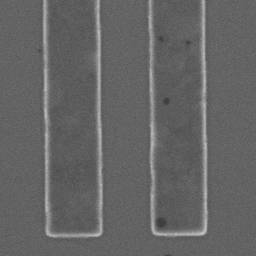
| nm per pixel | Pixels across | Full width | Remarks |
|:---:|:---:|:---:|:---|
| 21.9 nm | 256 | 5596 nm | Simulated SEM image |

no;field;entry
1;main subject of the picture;wiring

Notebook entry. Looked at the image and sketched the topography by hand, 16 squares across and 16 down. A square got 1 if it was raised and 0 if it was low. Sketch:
0001110001111000
0001110001111000
0001110001111000
0001110001111000
0001110001111000
0001110001111000
0001110001111000
0001110001111000
0001110001111000
0001110001111000
0001110001111000
0001110000111000
0001110000111000
0001110000111000
0001110000111000
0000000000000000